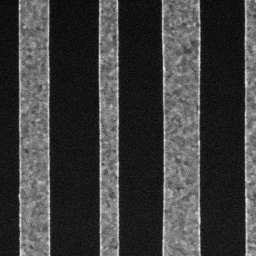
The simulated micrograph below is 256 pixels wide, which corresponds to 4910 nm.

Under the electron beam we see one or a few lines or trenches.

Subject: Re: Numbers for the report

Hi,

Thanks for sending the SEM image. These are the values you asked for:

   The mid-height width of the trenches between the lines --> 0.878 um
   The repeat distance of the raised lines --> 1410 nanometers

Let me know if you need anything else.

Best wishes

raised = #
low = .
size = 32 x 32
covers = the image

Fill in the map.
..####.......##.....#####......#
..####.......##.....#####......#
..####......###.....#####......#
..####......###.....#####......#
..####......###.....#####......#
..####......###.....#####......#
..####......###.....#####......#
..####......###.....#####......#
..####......###.....#####......#
..####......###.....#####......#
..####......###.....#####......#
...###......###.....#####......#
...###......###.....#####......#
...###.......##.....#####......#
..####.......##......####......#
..####.......##......####......#
..####.......##......####......#
...###.......##......####......#
..####.......##......####......#
..####.......##......####......#
...###.......##......####......#
...###.......##......####......#
...###.......##......####......#
..####.......##......####......#
..####.......##......####......#
...###.......##......####......#
...###.......##......####......#
...###.......##.....#####......#
...###.......##.....#####......#
...###.......##.....#####......#
...###.......##.....#####......#
...###.......##.....#####......#